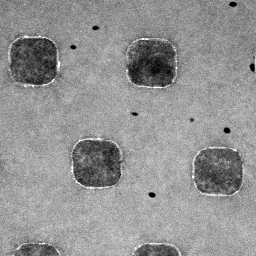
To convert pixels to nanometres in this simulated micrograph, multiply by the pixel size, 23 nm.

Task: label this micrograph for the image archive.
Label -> raised bodies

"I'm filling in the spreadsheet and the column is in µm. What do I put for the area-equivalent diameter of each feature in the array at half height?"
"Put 1.2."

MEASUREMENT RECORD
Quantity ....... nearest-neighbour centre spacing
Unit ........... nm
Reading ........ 2680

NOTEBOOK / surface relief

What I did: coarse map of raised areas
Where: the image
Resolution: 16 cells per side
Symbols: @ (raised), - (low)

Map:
----------------
----------------
-@@------@------
-@@@----@@@-----
-@@@----@@@-----
----------------
----------------
----------------
----------------
-----@@@-----@@-
-----@@@----@@@-
-----@@-----@@@-
----------------
----------------
----------------
-@@------@@-----